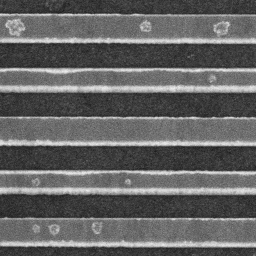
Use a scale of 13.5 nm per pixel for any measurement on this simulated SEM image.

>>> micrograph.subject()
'lines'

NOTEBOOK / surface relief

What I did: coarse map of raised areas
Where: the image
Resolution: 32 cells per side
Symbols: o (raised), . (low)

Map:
................................
................................
oooooooooooooooooooooooooooooooo
oooooooooooooooooooooooooooooooo
oooooooooooooooooooooooooooooooo
................................
................................
................................
................................
oooooooooooooooooooooooooooooooo
oooooooooooooooooooooooooooooooo
................................
................................
................................
................................
oooooooooooooooooooooooooooooooo
oooooooooooooooooooooooooooooooo
oooooooooooooooooooooooooooooooo
................................
................................
................................
oooooooooooooooooooooooooooooooo
oooooooooooooooooooooooooooooooo
oooooooooooooooooooooooooooooooo
................................
................................
................................
oooooooooooooooooooooooooooooooo
oooooooooooooooooooooooooooooooo
oooooooooooooooooooooooooooooooo
oooooooooooooooooooooooooooooooo
................................